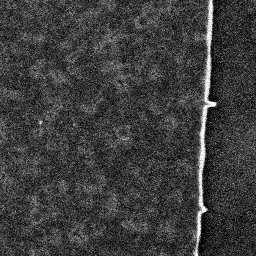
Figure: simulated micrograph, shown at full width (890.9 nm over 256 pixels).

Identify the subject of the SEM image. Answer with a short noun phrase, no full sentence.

one or a few lines or trenches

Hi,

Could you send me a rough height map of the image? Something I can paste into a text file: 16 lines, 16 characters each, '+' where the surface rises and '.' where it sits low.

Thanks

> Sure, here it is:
+++++++++++++...
+++++++++++++...
+++++++++++++...
+++++++++++++...
+++++++++++++...
+++++++++++++...
+++++++++++++...
+++++++++++++...
+++++++++++++...
+++++++++++++...
+++++++++++++...
+++++++++++++...
+++++++++++++...
+++++++++++++...
++++++++++++....
++++++++++++....